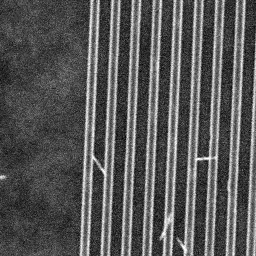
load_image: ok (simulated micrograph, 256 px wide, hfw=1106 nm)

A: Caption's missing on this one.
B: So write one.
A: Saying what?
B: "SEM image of parallel lines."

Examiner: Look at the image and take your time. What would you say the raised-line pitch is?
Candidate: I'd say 89.8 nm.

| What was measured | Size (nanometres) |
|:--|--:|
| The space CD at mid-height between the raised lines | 56.6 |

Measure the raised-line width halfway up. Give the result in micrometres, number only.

0.034